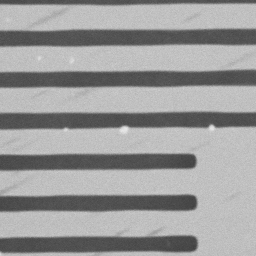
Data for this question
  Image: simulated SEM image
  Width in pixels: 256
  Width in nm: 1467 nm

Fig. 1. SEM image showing groups of lines, slits or small figures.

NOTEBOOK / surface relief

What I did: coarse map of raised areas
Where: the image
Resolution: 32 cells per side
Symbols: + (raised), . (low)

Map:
................................
++++++++++++++++++++++++++++++++
++++++++++++++++++++++++++++++++
++++++++++++++++++++++++++++++++
................................
................................
++++++++++++++++++++++++++++++++
++++++++++++++++++++++++++++++++
++++++++++++++++++++++++++++++++
................................
................................
++++++++++++++++++++++++++++++++
++++++++++++++++++++++++++++++++
++++++++++++++++++++++++++++++++
................................
................................
++++++++++++++++++++++++++++++++
++++++++++++++++++++++++++++++++
++++++++++++++++++++++++++++++++
........................++++++++
........................++++++++
++++++++++++++++++++++++++++++++
++++++++++++++++++++++++++++++++
++++++++++++++++++++++++++++++++
........................++++++++
.........................+++++++
..++++++++++++++++++++++++++++++
++++++++++++++++++++++++++++++++
++++++++++++++++++++++++++++++++
++++++++......+++++.....++++++++
.........................+++++++
.............++++++++...++++++++